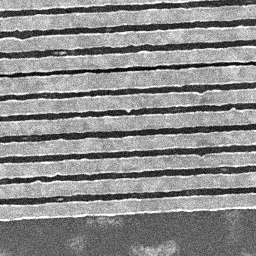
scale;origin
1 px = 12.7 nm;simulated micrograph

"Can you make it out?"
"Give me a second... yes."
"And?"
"parallel lines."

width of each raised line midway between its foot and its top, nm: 175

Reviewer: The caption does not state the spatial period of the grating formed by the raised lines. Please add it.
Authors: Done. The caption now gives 266 nm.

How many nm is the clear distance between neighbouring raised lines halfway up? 87.3